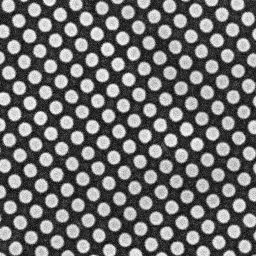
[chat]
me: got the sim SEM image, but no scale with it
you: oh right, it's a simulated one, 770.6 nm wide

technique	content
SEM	a regular array of raised bodies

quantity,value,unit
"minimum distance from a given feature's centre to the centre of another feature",55.3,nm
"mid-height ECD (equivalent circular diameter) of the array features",37.8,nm